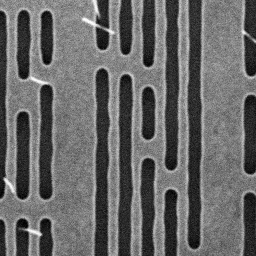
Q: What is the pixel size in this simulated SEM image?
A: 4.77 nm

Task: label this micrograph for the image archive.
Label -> groups of lines, slits or small figures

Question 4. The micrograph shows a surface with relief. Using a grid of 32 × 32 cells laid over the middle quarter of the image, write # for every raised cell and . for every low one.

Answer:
####################..###....##.
#########..##############....##.
########...##############....##.
########...###...########....##.
########...###...########....##.
########...###...########....##.
########...###...###..###....##.
########...###...##....##....##.
########...###...##....##....##.
########...###...##....##....##.
########...###...##....##....##.
########...###...##....##....##.
########...###...##....##....##.
########...###...##....##....##.
########....#....##....##....##.
########...###...##....##....##.
########...###...##....##....##.
########...###...##....##....##.
########...###...###..###....##.
########...###...########....##.
########...###...########....##.
########...###...########....##.
########...###...########....##.
########...###...###..###....##.
########...###...###...##....##.
########...###...##....##...###.
########...###...##....###..###.
########...###...##....########.
########...###...##....########.
########...###...##....########.
########...###...##....########.
########...###...##....###..###.